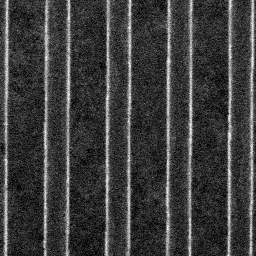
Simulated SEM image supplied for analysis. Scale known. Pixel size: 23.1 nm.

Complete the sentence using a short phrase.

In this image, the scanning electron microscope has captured lines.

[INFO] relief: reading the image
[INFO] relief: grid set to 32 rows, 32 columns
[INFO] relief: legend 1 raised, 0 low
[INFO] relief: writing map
10000011100001110000011100000111
10000011100001110000011100000111
10000011100001110000011100000111
10000011100001110000011100000110
10000011100001110000011100000110
10000011100001110000011100000110
10000011100001110000011100000110
10000011100001110000011100000110
10000011100001110000011100000110
10000011100000110000011100000110
10000011100000110000011100000110
10000011100001110000011100000110
10000011100001110000011100000110
10000011100001110000011100000110
10000011100001110000011100000110
10000011100001110000011100000110
10000011100001110000011100000110
10000011100001110000011100000110
10000011100001110000011100000110
10000011100001110000011100000110
10000011100001110000011100000110
10000011100001110000011100000110
10000011100001110000011100000110
10000011100001110000011100000110
10000011000001110000011100000110
10000011000001110000011100000110
10000011000001110000011100000110
10000011000001110000011100000110
10000011000001110000011100000110
10000011000001110000011100000110
10000011000001110000011100000110
10000011000001110000011100000110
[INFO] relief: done